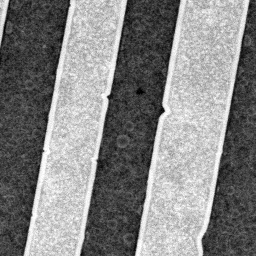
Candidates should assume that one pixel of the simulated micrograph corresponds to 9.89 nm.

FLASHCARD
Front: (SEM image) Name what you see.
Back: one or a few lines or trenches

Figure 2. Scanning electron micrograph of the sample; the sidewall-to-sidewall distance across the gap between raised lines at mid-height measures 576 nm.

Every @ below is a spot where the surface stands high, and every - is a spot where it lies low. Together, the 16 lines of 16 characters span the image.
----@@@@---@@@@-
----@@@@---@@@@-
----@@@----@@@@-
----@@@----@@@@-
----@@@----@@@@-
----@@@---@@@@--
---@@@@---@@@@--
---@@@----@@@@--
---@@@----@@@@--
---@@@----@@@@--
---@@@----@@@@--
--@@@@---@@@@---
--@@@----@@@@---
--@@@----@@@@---
--@@@----@@@@---
--@@@----@@@@---